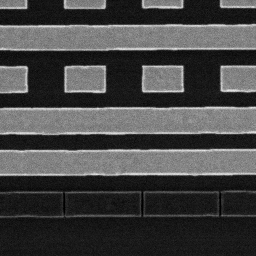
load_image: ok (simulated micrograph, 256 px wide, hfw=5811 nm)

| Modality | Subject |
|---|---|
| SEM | wiring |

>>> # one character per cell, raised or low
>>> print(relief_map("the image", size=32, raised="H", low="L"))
HHHLLLLLHHHHHLLLLLHHHHHLLLLLHHHH
LLLLLLLLLLLLLLLLLLLLLLLLLLLLLLLL
LLLLLLLLLLLLLLLLLLLLLLLLLLLLLLLL
HHHHHHHHHHHHHHHHHHHHHHHHHHHHHHHH
HHHHHHHHHHHHHHHHHHHHHHHHHHHHHHHH
HHHHHHHHHHHHHHHHHHHHHHHHHHHHHHHH
LLLLLLLLLLLLLLLLLLLLLLLLLLLLLLLL
LLLLLLLLLLLLLLLLLLLLLLLLLLLLLLLL
HHHLLLLLHHHHHLLLLLHHHHHLLLLLHHHH
HHHLLLLLHHHHHLLLLLHHHHHLLLLLHHHH
HHHLLLLLHHHHHLLLLLHHHHHLLLLLHHHH
HHLLLLLLLLLLLLLLLLLLLLLLLLLLLLLL
LLLLLLLLLLLLLLLLLLLLLLLLLLLLLLLL
LLLLLLLLLLLLLLLLLLLLLLLLLLLLLLLL
HHHHHHHHHHHHHHHHHHHHHHHHHHHHHHHH
HHHHHHHHHHHHHHHHHHHHHHHHHHHHHHHH
HHHHHHHHHHHHHHHHHHHHHHHHHHHHHHHH
LLLLLLLLLLLLLLLLLLLLLLLLLLLLLLLL
LLLLLLLLLLLLLLLLLLLLLLLLLLLLLLLL
HHHHHHHHHHHHHHHHHHHHHHHHHHHHHHHH
HHHHHHHHHHHHHHHHHHHHHHHHHHHHHHHH
HHHHHHHHHHHHHHHHHHHHHHHHHHHHHHHH
LLLLLLLLLLLLLLLLLLLLLLLLLLLLLLLL
LLLLLLLLLLLLLLLLLLLLLLLLLLLLLLLL
HHHHHHHHHHHHHHHHHHHHHHHHHHHHHHHH
HHHHHHHHHHHHHHHHHHHHHHHHHHHHHHHH
HHHHHHHHHHHHHHHHHHHHHHHHHHHHHHHH
LLLLLLLLLLLLLLLLLLLLLLLLLLLLLLLL
LLLLLLLLLLLLLLLLLLLLLLLLLLLLLLLL
LLLLLLLLLLLLLLLLLLLLLLLLLLLLLLLL
LLLLLLLLLLLLLLLLLLLLLLLLLLLLLLLL
LLLLLLLLLLLLLLLLLLLLLLLLLLLLLLLL